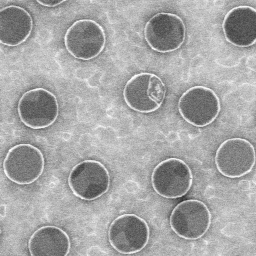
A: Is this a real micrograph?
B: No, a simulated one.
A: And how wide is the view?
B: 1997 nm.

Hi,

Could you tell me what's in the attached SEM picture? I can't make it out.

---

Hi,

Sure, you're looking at a regular array of raised bodies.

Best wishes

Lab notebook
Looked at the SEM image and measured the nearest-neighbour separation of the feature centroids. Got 450 nanometres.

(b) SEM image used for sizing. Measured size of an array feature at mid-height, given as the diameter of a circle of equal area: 0.309 µm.